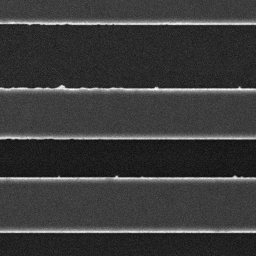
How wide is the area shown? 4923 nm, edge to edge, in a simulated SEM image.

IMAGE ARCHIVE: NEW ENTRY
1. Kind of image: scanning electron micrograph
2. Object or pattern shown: lines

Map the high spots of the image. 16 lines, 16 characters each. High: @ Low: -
@@@@@@@@@@@@@@@@
----@----@@-@@@@
----------------
----------------
----------------
----------------
@@@@@@@@@@@@@@@@
@@@@@@@@@@@@@@@@
@@@@@@@@@@@@@@@@
----------------
----------------
@@@@@@@@@@@@@@@@
@@@@@@@@@@@@@@@@
@@@@@@@@@@@@@@@@
@@@@@@@@@@@@@@@@
----------------